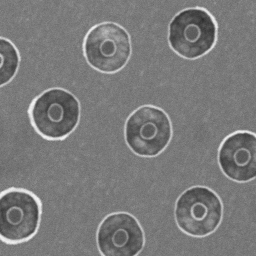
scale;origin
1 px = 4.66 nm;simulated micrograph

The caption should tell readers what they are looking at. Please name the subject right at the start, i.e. ring-shaped grooves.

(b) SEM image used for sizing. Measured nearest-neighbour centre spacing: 401 nanometers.